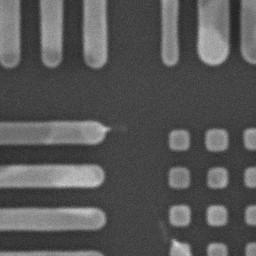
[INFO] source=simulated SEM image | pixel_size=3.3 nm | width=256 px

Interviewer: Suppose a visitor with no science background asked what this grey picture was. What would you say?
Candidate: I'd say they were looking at groups of lines, slits or small figures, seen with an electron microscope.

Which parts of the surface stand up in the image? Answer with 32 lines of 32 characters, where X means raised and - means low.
XX---XXX---XX-------XX---XXX--XX
XX---XXX---XX-------XX---XXX--XX
XX---XXX---XX-------XX---XXXX-XX
XX---XXX---XX-------XX---XXXX-XX
XX---XXX---XX-------XX---XXXX-XX
XX---XXX---XX-------XX---XXX--XX
XX---XXX---XX-------XX---XXX--XX
XX---XXX---XX-------XX---XXX---X
--------------------------------
--------------------------------
--------------------------------
--------------------------------
--------------------------------
--------------------------------
--------------------------------
XXXXXXXXXXXX--------------------
XXXXXXXXXXXXX---------X---XX---X
XXXXXXXXXXXXX--------XX---XX---X
----------------------X---XX---X
--------------------------------
--------------------------------
XXXXXXXXXXXXX--------XX---XX---X
XXXXXXXXXXXXX--------XXX--XX---X
--------------------------------
--------------------------------
--------------------------------
XXXXXXXXXXXXX--------XXX--XX---X
XXXXXXXXXXXXX--------XXX--XX---X
XXXXXXXXXXXX--------------------
--------------------------------
----------------------X---------
---------------------XXX--XX---X